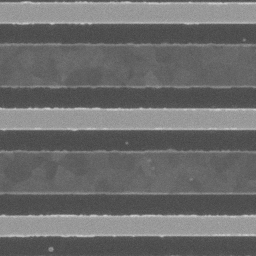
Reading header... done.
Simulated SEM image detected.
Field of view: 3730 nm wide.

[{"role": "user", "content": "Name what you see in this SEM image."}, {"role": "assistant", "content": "lines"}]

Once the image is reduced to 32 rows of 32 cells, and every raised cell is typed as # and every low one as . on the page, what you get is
################################
################################
################################
................................
................................
.###.###.####...#.#.......#.....
################################
################################
################################
################################
################################
................................
................................
................................
################################
################################
................................
................................
................................
################################
################################
################################
################################
################################
................................
................................
................................
################################
################################
#####..#####........#...........
................................
................................